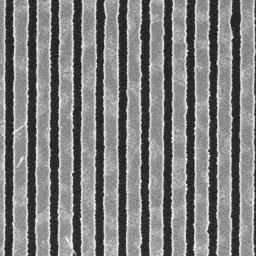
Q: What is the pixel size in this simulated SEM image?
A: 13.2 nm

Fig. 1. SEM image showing parallel lines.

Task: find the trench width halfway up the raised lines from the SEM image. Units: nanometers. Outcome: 113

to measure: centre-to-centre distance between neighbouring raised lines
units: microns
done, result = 0.3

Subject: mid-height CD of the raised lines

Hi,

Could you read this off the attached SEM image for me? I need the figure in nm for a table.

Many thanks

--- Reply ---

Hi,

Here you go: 184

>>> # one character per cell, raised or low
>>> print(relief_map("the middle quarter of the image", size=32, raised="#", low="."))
##...###..####..###.....#..###..
##..##.#..####..###....##..####.
##...#.#..####..###...###..####.
##..####..####..###...###..####.
##...###..####..###..####..##...
##...###..####..###..####..####.
##..####..####..###...###..####.
##..####..####..###..####..####.
##...###..####..###...###..####.
##...###..####..###..####..####.
##...###..#.##..###..####..####.
##...###..####..###..####..####.
##..####..####..###...###..####.
##...###..####..###...###..###..
##...###..###...###...###..####.
##..####..###...###...###..###..
##..####..###...###..####..###..
##..####..###...###..####....#..
##..####..###...###..####....##.
##..####..####..###..####..###..
##..####..####..###..####..###..
#...####..###...###..####..###..
##..####..###...###..####..####.
##..####..####..###..####..####.
##..####..####..###..####..####.
##..####..####..###..####..###..
##..####..###...###..####..###..
##..####..###...###..####..####.
##..####..###...###..####..####.
##..####..####..###....##..###..
##..####..###...###....##..####.
##..####..###...###..####..####.